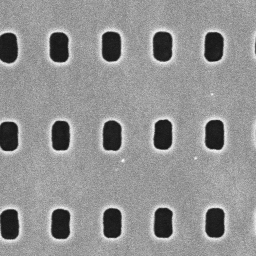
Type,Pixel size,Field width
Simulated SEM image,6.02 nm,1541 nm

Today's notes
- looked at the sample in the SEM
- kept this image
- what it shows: a regular array of holes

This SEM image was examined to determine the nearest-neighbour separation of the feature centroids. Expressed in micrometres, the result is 0.309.